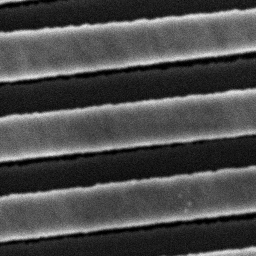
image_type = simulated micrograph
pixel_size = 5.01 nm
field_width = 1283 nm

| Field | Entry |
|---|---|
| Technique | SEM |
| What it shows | lines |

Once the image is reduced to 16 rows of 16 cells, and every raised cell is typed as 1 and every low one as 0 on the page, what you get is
0000000000000000
0000001111111111
1111111111111111
1111111111111100
1111100000000000
0000000000000000
0000000111111111
1111111111111111
1111111111111110
1111110000000000
0000000000000001
0000001111111111
1111111111111111
1111111111111100
1111110000000000
0000000000000001